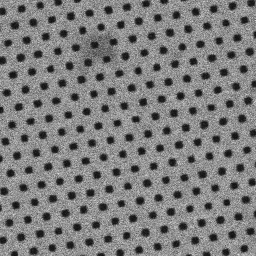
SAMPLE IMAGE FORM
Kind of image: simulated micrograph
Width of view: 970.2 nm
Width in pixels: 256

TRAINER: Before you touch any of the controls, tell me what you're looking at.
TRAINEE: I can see a regular array of holes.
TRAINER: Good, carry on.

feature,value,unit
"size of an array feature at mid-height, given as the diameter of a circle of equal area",7.97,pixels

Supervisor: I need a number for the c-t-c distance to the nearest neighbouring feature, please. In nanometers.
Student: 69.2